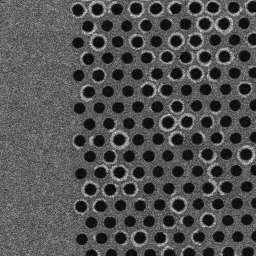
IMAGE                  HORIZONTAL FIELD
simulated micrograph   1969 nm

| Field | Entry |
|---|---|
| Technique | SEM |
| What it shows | a regular array of holes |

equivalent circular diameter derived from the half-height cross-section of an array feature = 0.0893 microns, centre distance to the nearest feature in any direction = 143 nanometres